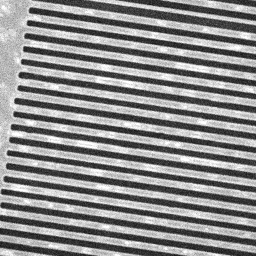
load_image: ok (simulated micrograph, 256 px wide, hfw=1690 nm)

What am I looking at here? parallel lines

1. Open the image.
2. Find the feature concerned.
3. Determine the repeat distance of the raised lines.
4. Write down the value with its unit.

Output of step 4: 86.6 nm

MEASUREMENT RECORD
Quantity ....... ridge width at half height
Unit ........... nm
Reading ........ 44.8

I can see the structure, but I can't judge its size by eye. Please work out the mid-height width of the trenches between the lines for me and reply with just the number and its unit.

44.8 nm